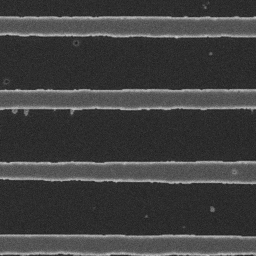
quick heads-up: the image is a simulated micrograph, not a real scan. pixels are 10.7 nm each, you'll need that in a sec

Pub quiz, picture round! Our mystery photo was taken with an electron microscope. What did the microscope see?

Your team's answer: lines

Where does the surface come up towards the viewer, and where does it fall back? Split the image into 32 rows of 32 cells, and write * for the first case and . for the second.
................................
................................
********************************
********************************
..............**..**************
................................
................................
................................
................................
................................
................................
********************************
********************************
********************************
................................
................................
................................
................................
................................
................................
********************************
********************************
.....****.**********************
................................
................................
................................
................................
................................
................................
****************....*****.......
********************************
********************************